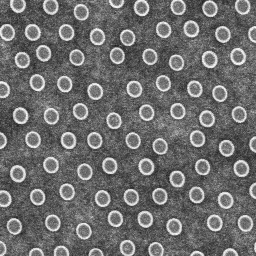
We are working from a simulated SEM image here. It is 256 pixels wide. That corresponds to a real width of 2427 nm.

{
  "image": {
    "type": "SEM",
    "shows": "a regular array of raised bodies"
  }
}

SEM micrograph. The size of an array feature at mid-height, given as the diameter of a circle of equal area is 139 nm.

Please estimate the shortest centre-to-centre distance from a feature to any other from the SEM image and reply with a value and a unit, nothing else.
248 nm